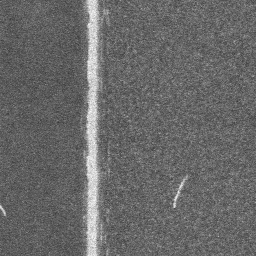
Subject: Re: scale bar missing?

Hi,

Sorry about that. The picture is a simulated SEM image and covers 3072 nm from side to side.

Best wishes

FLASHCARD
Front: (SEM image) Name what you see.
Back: one or a few lines or trenches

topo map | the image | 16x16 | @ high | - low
@@@@@@----------
@@@@@@----------
@@@@@@----------
@@@@@@----------
@@@@@@----------
@@@@@@----------
@@@@@@----------
@@@@@@----------
@@@@@@----------
@@@@@@----------
@@@@@@----------
@@@@@@----------
@@@@@@----------
@@@@@@----------
@@@@@@----------
@@@@@@----------